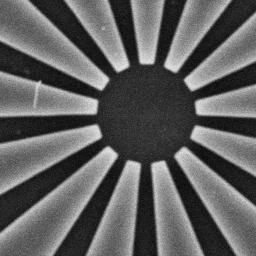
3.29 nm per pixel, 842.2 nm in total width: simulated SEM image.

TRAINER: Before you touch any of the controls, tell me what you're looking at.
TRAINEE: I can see groups of lines, slits or small figures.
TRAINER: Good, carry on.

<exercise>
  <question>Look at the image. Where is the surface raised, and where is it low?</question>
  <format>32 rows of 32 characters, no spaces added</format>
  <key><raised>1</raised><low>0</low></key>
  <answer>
11110000111111001111000111111000
11111000011111000111000111110000
11111100001111000111000111100001
11111110000111100111001111000011
11111111000111100111001110000111
01111111100011100111011110001111
00011111110001110110011100011111
00000111111000110110011000111111
00000001111100110000010001111100
11000000011110000000000011110000
11111000000110000000000111000000
11111111100000000000000000000111
11111111111100000000000001111111
11111111111100000000000011111111
10000000000000000000000000000111
00000000000000000000000000000000
00000001111100000000000011110000
00011111111100000000000011111111
11111111110000000000000000111111
11111111100011100000001100001111
11111110000111001001101111000111
11111000001110011001100111100001
11100000111110011001110011110000
10000001111100111001110011111000
00000011111000111001110001111100
00000111111000111001111000111111
00011111110001111001111000111111
00111111100001111001111100011111
01111111100011111000111100011111
11111111000011111000111100001111
11111111000111111000111110000111
11111110000111111000111110000111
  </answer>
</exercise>